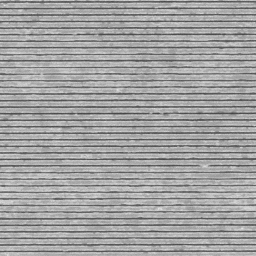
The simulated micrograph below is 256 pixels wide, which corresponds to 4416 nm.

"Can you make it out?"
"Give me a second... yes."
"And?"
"parallel lines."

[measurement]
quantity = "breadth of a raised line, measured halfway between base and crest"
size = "79.8 nm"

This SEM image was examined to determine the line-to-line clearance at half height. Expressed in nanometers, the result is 32.3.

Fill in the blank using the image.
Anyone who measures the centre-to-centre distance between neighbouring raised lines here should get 113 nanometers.